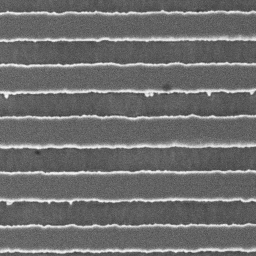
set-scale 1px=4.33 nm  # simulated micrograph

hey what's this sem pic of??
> lines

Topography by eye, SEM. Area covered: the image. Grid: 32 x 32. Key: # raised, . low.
................................
....................#.....####.#
################################
################################
################################
................................
................................
................................
################################
################################
################################
###########.###.######.##...##..
................................
................................
..........##..........#.#.....##
################################
################################
################################
................................
................................
................................
#...#.....#.#.##################
################################
################################
################################
................................
................................
................................
################################
################################
################################
.......#........................